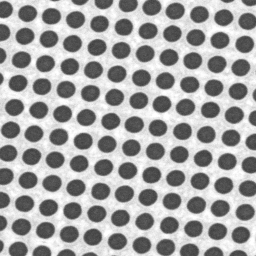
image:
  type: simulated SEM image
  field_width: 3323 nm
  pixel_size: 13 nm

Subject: a regular array of holes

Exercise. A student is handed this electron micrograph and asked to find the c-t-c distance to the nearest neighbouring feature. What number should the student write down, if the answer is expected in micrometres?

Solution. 0.302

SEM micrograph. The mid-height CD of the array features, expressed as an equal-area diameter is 0.237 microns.